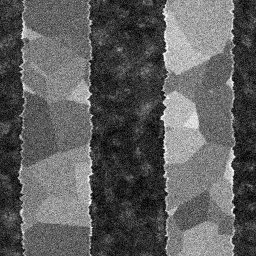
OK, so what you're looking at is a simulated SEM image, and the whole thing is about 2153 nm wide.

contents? one or a few lines or trenches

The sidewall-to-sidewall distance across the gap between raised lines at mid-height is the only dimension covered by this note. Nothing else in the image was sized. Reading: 0.629 um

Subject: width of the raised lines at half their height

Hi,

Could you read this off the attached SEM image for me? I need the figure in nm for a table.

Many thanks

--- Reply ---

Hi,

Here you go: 568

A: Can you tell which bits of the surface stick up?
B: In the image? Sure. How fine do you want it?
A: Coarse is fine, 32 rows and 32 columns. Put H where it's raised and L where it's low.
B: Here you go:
LLLHHHHHHHHLLLLLLLLLLHHHHHHHHLLL
LLLHHHHHHHHLLLLLLLLLLHHHHHHHHLLL
LLLHHHHHHHHLLLLLLLLLLHHHHHHHHLLL
LLLHHHHHHHHLLLLLLLLLLHHHHHHHHLLL
LLLHHHHHHHHLLLLLLLLLLHHHHHHHHLLL
LLLHHHHHHHHLLLLLLLLLLHHHHHHHHLLL
LLLHHHHHHHHLLLLLLLLLLHHHHHHHHLLL
LLLHHHHHHHHLLLLLLLLLLHHHHHHHHLLL
LLLHHHHHHHHLLLLLLLLLLHHHHHHHHLLL
LLLHHHHHHHHLLLLLLLLLLHHHHHHHHLLL
LLLHHHHHHHHLLLLLLLLLLHHHHHHHHLLL
LLLHHHHHHHHLLLLLLLLLHHHHHHHHHLLL
LLLHHHHHHHHLLLLLLLLLLHHHHHHHHLLL
LLLHHHHHHHHLLLLLLLLLLHHHHHHHHLLL
LLLHHHHHHHHLLLLLLLLLHHHHHHHHHLLL
LLLHHHHHHHHLLLLLLLLLLHHHHHHHHLLL
LLLHHHHHHHHLLLLLLLLLHHHHHHHHHLLL
LLLHHHHHHHHLLLLLLLLLLHHHHHHHHLLL
LLLHHHHHHHHLLLLLLLLLLHHHHHHHHLLL
LLLHHHHHHHHLLLLLLLLLLHHHHHHHHLLL
LLLHHHHHHHHLLLLLLLLLLHHHHHHHHLLL
LLLHHHHHHHHLLLLLLLLLLHHHHHHHHLLL
LLHHHHHHHHHLLLLLLLLLLHHHHHHHHLLL
LLLHHHHHHHHLLLLLLLLLLHHHHHHHHLLL
LLLHHHHHHHHLLLLLLLLLLHHHHHHHHLLL
LLLHHHHHHHHLLLLLLLLLLHHHHHHHHLLL
LLLHHHHHHHHLLLLLLLLLLHHHHHHHHLLL
LLLHHHHHHHHLLLLLLLLLLHHHHHHHHLLL
LLLHHHHHHHHLLLLLLLLLLHHHHHHHHLLL
LLLHHHHHHHHLLLLLLLLLLHHHHHHHHLLL
LLLHHHHHHHHLLLLLLLLLLHHHHHHHHLLL
LLLHHHHHHHHLLLLLLLLLLHHHHHHHHLLL